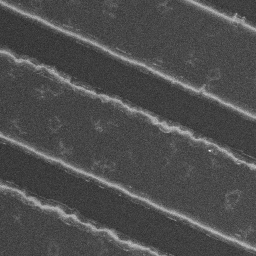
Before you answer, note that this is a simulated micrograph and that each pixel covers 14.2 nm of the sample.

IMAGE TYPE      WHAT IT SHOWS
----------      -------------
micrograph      one or a few lines or trenches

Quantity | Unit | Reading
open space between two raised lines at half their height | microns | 0.634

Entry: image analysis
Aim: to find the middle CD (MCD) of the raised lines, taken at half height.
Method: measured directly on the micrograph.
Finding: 1.11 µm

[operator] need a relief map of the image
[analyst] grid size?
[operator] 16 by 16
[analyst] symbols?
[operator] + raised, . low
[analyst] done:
.++++++++++++...
...++++++++++++.
.....+++++++++++
+......+++++++++
+++.......++++++
+++++.......++++
++++++++......++
++++++++++......
++++++++++++....
..++++++++++++..
.....+++++++++++
.......+++++++++
++.......+++++++
++++.......+++++
+++++++......+++
+++++++++.......